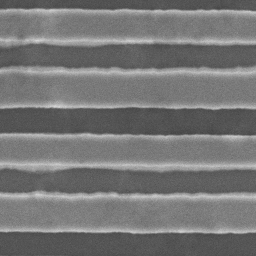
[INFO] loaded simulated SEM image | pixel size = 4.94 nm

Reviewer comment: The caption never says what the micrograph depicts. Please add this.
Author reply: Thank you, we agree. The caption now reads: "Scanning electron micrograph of lines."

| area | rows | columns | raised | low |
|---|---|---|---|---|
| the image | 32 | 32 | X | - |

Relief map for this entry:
--------------------------------
XXXXXXXXXXXXXXXXXXXXXXXXXXXXXXXX
XXXXXXXXXXXXXXXXXXXXXXXXXXXXXXXX
XXXXXXXXXXXXXXXXXXXXXXXXXXXXXXXX
XXXXXXXXXXXXXXXXXXXXXXXXXXXXXXXX
--------------------------------
--------------------------------
--------------------------------
--------------------------------
XXXXXXXXXXXXXXXXXXXXXXXXXXXXXXXX
XXXXXXXXXXXXXXXXXXXXXXXXXXXXXXXX
XXXXXXXXXXXXXXXXXXXXXXXXXXXXXXXX
XXXXXXXXXXXXXXXXXXXXXXXXXXXXXXXX
X--------X--XXX-----XXXXXXXXXXXX
--------------------------------
--------------------------------
--------------------------------
XXXXXXXXXXXXXXXXXXXXXXXXXXXXXXXX
XXXXXXXXXXXXXXXXXXXXXXXXXXXXXXXX
XXXXXXXXXXXXXXXXXXXXXXXXXXXXXXXX
XXXXXXXXXXXXXXXXXXXXXXXXXXXXXXXX
--------------------------------
--------------------------------
--------------------------------
XXXXXXXXXXXXXXXXXXXXXXXXXXXXXXXX
XXXXXXXXXXXXXXXXXXXXXXXXXXXXXXXX
XXXXXXXXXXXXXXXXXXXXXXXXXXXXXXXX
XXXXXXXXXXXXXXXXXXXXXXXXXXXXXXXX
XXXXXXXXXXXXXXXXXXXXXXXXXXXXXXXX
--------------------------------
--------------------------------
--------------------------------